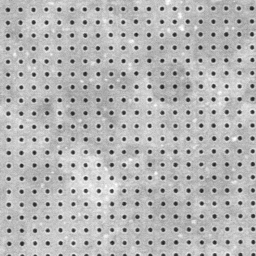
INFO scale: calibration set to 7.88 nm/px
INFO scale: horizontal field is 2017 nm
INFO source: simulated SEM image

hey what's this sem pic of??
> a regular array of holes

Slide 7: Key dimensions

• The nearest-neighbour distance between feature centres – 99.4 nm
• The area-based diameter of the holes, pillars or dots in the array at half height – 38.8 nanometres